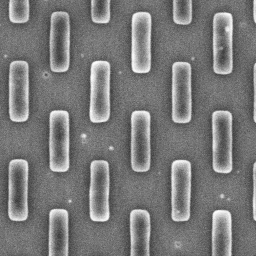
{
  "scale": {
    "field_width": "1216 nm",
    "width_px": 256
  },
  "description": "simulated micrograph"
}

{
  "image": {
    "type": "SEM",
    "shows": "groups of lines, slits or small figures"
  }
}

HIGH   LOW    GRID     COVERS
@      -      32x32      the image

-@@@-------@@@--------@@--------
-@@@-------@@@--------@@--------
-@@---@@@---@----@@---@@---@@---
------@@@--------@@--------@@---
------@@@--------@@--------@@---
------@@@--------@@--------@@---
------@@@--------@@--------@@---
------@@@--------@@--------@@---
-@@---@@---@@@---@@---@@---@@---
-@@--------@@@--------@@--------
-@@--------@@@--------@@--------
-@@--------@@@--------@@--------
-@@--------@@@--------@@--------
-@@--------@@@--------@@--------
-@@---@@@--@@@--@@@---@@---@@---
------@@@-------@@@--------@@---
------@@@-------@@@--------@@---
------@@@-------@@@--------@@---
------@@@-------@@@--------@@---
------@@@-------@@@--------@@---
-@@---@@@--@@---@@@---@@---@@---
-@@--------@@---------@@--------
-@@--------@@@--------@@--------
-@@--------@@@--------@@--------
-@@--------@@---------@@--------
-@@--------@@---------@@--------
-@@---@@---@@----@----@@---@----
------@@----@---@@@---@----@@---
------@@--------@@@--------@@---
------@@--------@@@--------@@---
------@@--------@@@--------@@---
------@@--------@@@--------@@---